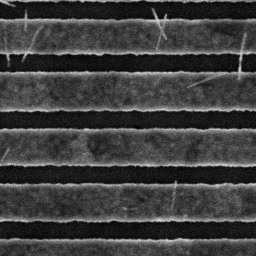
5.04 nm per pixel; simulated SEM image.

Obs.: lines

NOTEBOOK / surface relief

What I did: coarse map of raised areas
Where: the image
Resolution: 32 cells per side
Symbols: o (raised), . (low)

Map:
................................
................................
o.ooooo.oooo....oo.oooo..o.oo..o
oooooooooooooooooooooooooooooooo
oooooooooooooooooooooooooooooooo
oooooooooooooooooooooooooooooooo
oooooooooooooooooooooooooooooooo
................................
................................
oooooooooooooooooooooooooooooooo
oooooooooooooooooooooooooooooooo
oooooooooooooooooooooooooooooooo
oooooooooooooooooooooooooooooooo
oooooooooooooooooooooooooooooooo
................................
................................
oooooooooooooooooooooooooooooooo
oooooooooooooooooooooooooooooooo
oooooooooooooooooooooooooooooooo
oooooooooooooooooooooooooooooooo
oooooooooooooooooooooooooooooooo
................................
................................
oooooooooooooooooooooooooooooooo
oooooooooooooooooooooooooooooooo
oooooooooooooooooooooooooooooooo
oooooooooooooooooooooooooooooooo
oooooooooooooooooooooooooooooooo
................................
................................
oooooooooooooooooooooooooooooooo
oooooooooooooooooooooooooooooooo